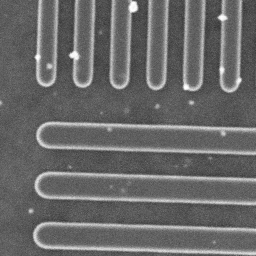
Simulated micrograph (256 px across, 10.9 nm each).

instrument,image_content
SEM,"groups of lines, slits or small figures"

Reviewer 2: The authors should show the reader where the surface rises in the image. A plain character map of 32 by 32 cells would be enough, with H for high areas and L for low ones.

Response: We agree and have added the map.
LLLLLHHLLHHHLLHHHLLHHLLHHHLLHHLL
LLLLLHHLLHHHLLHHHLLHHLLHHHLLHHLL
LLLLLHHLLHHHLLHHLLLHHLLHHLLLHHLL
LLLLLHHLLHHHLLHHLLLHHLLHHLLLHHLL
LLLLLHHLLHHHLLHHLLLHHLLHHLLLHHLL
LLLLLHHLLHHHLLHHLLLHHLLHHLLLHHLL
LLLLLHHLLHHHLLHHLLLHHLLHHLLLHHLL
LLLLLHHLLHHHLLHHLLLHHLLHHLLLHHLL
LLLLLHHLLHHHLLHHLLHHHLLHHLLLHHLL
LLLLLHHLLHHHLLHHLLHHHLLHHLLLHHLL
LLLLLHLLLLHLLLHHLLLHLLLHHLLLHHLL
LLLLLLLLLLLLLLLLLLLLLLLLLLLLLLLL
LLLLLLLLLLLLLLLLLLLLLLLLLLLLLLLL
LLLLLLLLLLLLLLLLLLLLLLLLLLLLLLLL
LLLLLLLLLLLLLLLLLLLLLLLLLLLLLLLL
LLLLLLHHHHHHLLLLLLLLLLLLLLLLLLLL
LLLLLHHHHHHHHHHHHHHHHHHHHHHHHHHH
LLLLLHHHHHHHHHHHHHHHHHHHHHHHHHHH
LLLLLLLHHHHHHHHHHHHHHHHHHHHHHHHH
LLLLLLLLLLLLLLLLLLLLLLLLLLLLLLLL
LLLLLLLLLLLLLLLLLLLLLLLLLLLLLLLL
LLLLLLLLLLLLLLLLLLLLLLLLLLLLLLLL
LLLLLHHHHHHHHHHHHHHHHHHHHHHHHHHH
LLLLHHHHHHHHHHHHHHHHHHHHHHHHHHHH
LLLLLHHHHHHHHHHHHHHHHHHHHHHHHHHH
LLLLLLLLLLLLLLLLLLLLLLLLLLLLLHHH
LLLLLLLLLLLLLLLLLLLLLLLLLLLLLLLL
LLLLLLLLLLLLLLLLLLLLLLLLLLLLLLLL
LLLLLHHHHHHHHHHHHHHHHHHHHHHLLLLL
LLLLHHHHHHHHHHHHHHHHHHHHHHHHHHHH
LLLLLHHHHHHHHHHHHHHHHHHHHHHHHHHH
LLLLLLLLLLLLLLLLLLLLLLHHHHHHHHHH